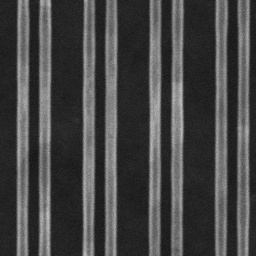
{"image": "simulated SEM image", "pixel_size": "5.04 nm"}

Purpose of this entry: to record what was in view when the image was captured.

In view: wiring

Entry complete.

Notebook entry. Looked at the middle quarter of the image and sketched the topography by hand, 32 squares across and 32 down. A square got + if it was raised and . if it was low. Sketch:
.....++....++.........++...++...
.....++....++.........++...++...
.....++....++.........++...++...
.....++....++.........++...++...
.....++....++.........++...++...
.....++....++.........++...++...
.....++....++.........++...++...
.....++....++.........++...++...
.....++....++.........++...++...
.....++....++.........++...++...
.....++....++.........++...++...
.....++....++.........++...++...
.....++....++.........++...++...
.....++....++.........++...++...
.....++....++.........++...++...
.....++....++.........++...++...
.....++....++.........++...++...
.....++....++.........++...++...
.....++....++.........++...++...
.....++....++.........++...++...
.....++....++.........++...++...
.....++....++.........++...++...
.....++....++.........++...++...
.....++....++.........++...++...
.....++....++.........++...++...
.....++....++.........++...++...
.....++....++.........++...++...
.....++....++.........++...++...
.....++....++.........++...++...
.....++....++.........++...++...
.....++....++.........++...++...
.....++....++.........++...++...